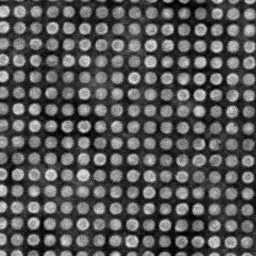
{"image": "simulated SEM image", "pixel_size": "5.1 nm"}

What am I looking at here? a regular array of raised bodies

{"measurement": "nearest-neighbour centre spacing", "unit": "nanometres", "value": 81.3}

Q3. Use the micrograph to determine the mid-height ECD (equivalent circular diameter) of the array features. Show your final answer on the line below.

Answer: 56.4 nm